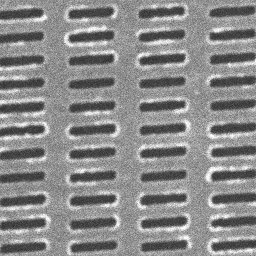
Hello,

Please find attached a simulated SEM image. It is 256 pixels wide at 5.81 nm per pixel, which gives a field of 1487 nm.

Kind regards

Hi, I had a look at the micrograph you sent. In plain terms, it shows a regular array of holes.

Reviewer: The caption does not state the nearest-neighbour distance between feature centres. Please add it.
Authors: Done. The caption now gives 135 nm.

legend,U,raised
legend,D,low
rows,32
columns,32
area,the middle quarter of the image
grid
UUDUUUUUUUUUUUUUUUUDUUUUUUUUUUUU
UUUUUUUUUUUUUUUUUUUUUUUUUUUUUUUU
UUUUUUUUUUUUUUUUUUUUUUUUUUUUUUUU
UUUUUUUDDDDDUUUUUUUUUDDDDDDDDDUU
UDDDDDDDDDDDDUUUUUUDDDDDDDDDDDUU
UDDDDDDDDDDDUUUUUUUDDDDDDDDDDDUU
UUUUUUUUUUUUUUUUUUUUUUUUUUUUUUUU
UUUUUUUUUUUUUUUUUUUUUUUUUUUUUUUU
UUUUUUUUUUUUUUUUUUUUUUUUUUUUUUUU
UUUUUDDDDDDDDUUUUUUUDDDDDDDDDDUU
UDDDDDDDDDDDDUUUUUUDDDDDDDDDDDUU
UDDDDDDDDDDDUUUUUUUDDDDDDDDDUUUU
UUUUUUUUUUUUUUUUUUUUUUUUUUUUUUUU
UUUUUUUUUUUUUUUUUUUUUUUUUUUUUUUU
UUUUUUUUUUUUUUUUUUUUUUUUUUUUUUUU
UUDDDDDDDDDDDUUUUUUDDDDDDDDDDDDU
UDDDDDDDDDDDDUUUUUUDDDDDDDDDDDDU
UDDDDDDDDDUUUUUUUUUDDDDDDDDDUUUU
UUUUUUUUUUUUUUUUUUUUUUUUUUUUUUUU
UUUUUUUUUUUUUUUUUUUUUUUUUUUUUUUU
UUUUUUUUUUUUUUUUUUUUUUUUUUUUDDUU
UUDDDDDDDDDDDUUUUUUDDDDDDDDDDDDU
UDDDDDDDDDDDDUUUUUUDDDDDDDDDDDDU
UUDDDDDDDUUUUUUUUUUDDDDDDUUUUUUU
UUUUUUUUUUUUUUUUUUUUUUUUUUUUUUUU
UUUUUUUUUUUUUUUUUUUUUUUUUUUUUUUU
UUUUUUUUUUUUUUUUUUUUUUUUUUDDDDUU
UUDDDDDDDDDDDUUUUUUDDDDDDDDDDDDU
UDDDDDDDDDDDDUUUUUUDDDDDDDDDDDUU
UDDDDUUUUUUUUUUUUUUDDDDUUUUUUUUU
UUUUUUUUUUUUUUUUUUUUUUUUUUUUUUUU
UUUUUUUUUUUUUUUUUUUUUUUUUUUUUUUU